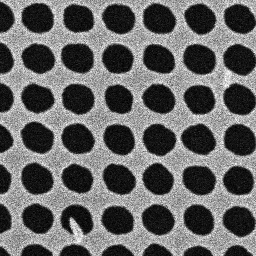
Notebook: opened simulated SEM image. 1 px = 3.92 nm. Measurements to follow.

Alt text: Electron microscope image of a regular array of holes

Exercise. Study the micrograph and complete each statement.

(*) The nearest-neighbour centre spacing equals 156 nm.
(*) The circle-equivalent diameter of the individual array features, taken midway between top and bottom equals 31.1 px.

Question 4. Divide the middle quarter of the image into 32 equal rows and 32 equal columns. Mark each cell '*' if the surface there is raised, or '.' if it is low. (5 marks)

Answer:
.......***.......***........**..
*......****......****......****.
****.*******..******************
********************************
********************************
*....*******...******....*******
.......****.....****.......****.
.......***.......***.......***..
........**.......**.........**..
........**.......***........**..
.......****......***........***.
*......****......****......*****
***..*********.*********..******
********************************
********************************
*....******.....******...*******
......****.......***.......***..
.......***.......***........**..
........**........**........*...
........**........**........**..
.......***........**........**..
*......****......****......****.
***..********...*******...******
********************************
********************************
*...*******....******....*******
......****......****......****..
.......***.......***.......**...
.......***........**.......**...
.......***........**.......***..
.......****.......**.......***..
*......****......****......****.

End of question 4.